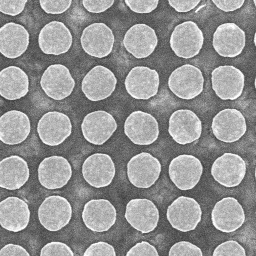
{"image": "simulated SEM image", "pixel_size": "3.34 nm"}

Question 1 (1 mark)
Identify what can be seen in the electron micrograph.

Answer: a regular array of raised bodies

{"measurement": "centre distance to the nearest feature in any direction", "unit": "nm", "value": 140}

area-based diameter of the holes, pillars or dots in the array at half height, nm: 112